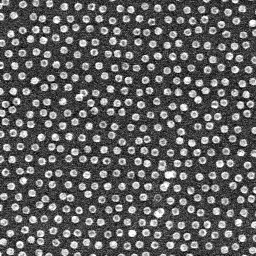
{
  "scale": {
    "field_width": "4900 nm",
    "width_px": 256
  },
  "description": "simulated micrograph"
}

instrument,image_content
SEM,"a regular array of raised bodies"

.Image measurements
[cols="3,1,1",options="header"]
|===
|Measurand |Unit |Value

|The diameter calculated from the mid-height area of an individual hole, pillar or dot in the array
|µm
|0.124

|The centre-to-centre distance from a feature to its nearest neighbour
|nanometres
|211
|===